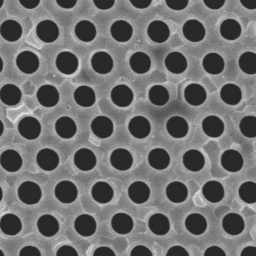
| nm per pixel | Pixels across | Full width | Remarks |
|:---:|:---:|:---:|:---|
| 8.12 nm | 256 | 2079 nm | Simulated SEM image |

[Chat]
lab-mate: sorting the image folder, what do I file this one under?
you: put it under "a regular array of holes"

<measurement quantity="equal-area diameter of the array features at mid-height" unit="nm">178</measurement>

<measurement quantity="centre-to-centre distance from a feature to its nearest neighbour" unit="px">36.1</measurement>